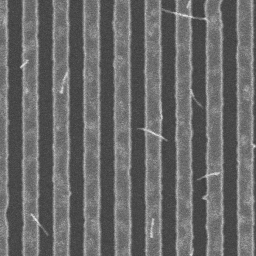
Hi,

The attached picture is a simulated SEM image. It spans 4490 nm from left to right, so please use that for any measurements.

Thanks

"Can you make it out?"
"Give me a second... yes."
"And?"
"parallel lines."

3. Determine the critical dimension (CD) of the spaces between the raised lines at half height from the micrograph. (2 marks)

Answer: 263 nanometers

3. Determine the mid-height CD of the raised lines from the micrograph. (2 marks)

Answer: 276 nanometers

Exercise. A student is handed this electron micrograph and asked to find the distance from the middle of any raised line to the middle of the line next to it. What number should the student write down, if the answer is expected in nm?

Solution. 538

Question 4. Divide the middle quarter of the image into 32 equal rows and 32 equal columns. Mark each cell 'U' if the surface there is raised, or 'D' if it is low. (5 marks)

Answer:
UDDDDUUUUDDDUUUUDDDDUUUUDDDDUUUU
UDDDDUUUUDDDDUUUDDDDUUUUDDDDUUUU
UDDDDUUUUDDDDUUUDDDDUUUUDDDDUUUU
UDDDDUUUUDDDDUUUDDDDUUUUDDDDUUUU
UDDDDUUUUDDDDUUUDDDDUUUUDDDDUUUU
UDDDDUUUUDDDDUUUDDDDUUUUDDDDUUUU
UDDDDUUUUDDDDUUUUDDDUUUUDDDDUUUU
UDDDDUUUUDDDDUUUUDDDDUUUDDDDUUUU
UDDDDUUUUDDDDUUUUDDDUUUUDDDDUUUU
UDDDDUUUUDDDDUUUDDDDUUUUDDDDUUUU
UDDDDUUUUDDDDUUUUDDDUUUUDDDDUUUU
UDDDDUUUUDDDDUUUUDDDUUUUDDDDUUUU
UDDDDUUUUDDDDUUUUDDDUUUUDDDDUUUU
UDDDDUUUUDDDUUUUUDDDUUUUUDDDUUUU
UDDDDUUUUDDDDUUUUDDDUUUUDDDDUUUU
UDDDDUUUUDDDDUUUDDDDUUUUDDDDUUUU
UDDDDUUUUDDDDUUUUDDDUUUUDDDDUUUU
UDDDDUUUUDDDDUUUDDDDUUUUDDDDUUUU
UDDDDUUUUDDDDUUUUDDDUUUUUDDDUUUU
UDDDDUUUUDDDDUUUUDDDUUUUDDDDUUUU
UDDDDUUUUDDDDUUUUDDDDUUUDDDDUUUU
UDDDDUUUUDDDDUUUUDDDDUUUDDDDUUUU
UDDDDUUUUDDDDUUUUDDDDUUUDDDDUUUU
UDDDDUUUUDDDDUUUUDDDDUUUDDDDUUUU
UDDDDUUUUDDDDUUUDDDDUUUUDDDDUUUU
UDDDDUUUUDDDDUUUUDDDUUUUDDDDUUUU
UDDDDUUUUDDDDUUUDDDDDUUUDDDDUUUU
UDDDDUUUUDDDDUUUDDDDDUUUDDDDUUUU
UDDDDUUUUDDDDUUUDDDDUUUUDDDDUUUU
UDDDDUUUUDDDDUUUDDDDUUUUDDDDUUUU
UDDDDUUUUDDDDUUUDDDDUUUUDDDDUUUU
UDDDDUUUUDDDDUUUDDDDUUUUDDDDUUUU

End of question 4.